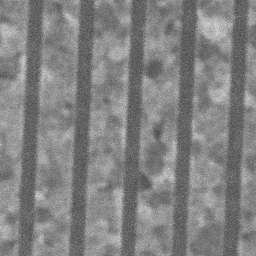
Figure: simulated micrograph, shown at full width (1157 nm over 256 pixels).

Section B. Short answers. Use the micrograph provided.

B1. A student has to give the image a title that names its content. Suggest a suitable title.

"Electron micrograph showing parallel lines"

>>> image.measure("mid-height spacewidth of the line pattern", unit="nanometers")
77.3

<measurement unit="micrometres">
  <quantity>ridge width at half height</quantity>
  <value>0.154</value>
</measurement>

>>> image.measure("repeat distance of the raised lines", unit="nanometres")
231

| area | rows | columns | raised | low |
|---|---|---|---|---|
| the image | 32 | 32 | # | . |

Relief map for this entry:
###...####..####..#####..####..#
###...####..####..#####..####..#
###..#####..####..#####..####..#
###...####..####..#####..####..#
###..#####..####..####...####..#
###..#####..####..####...####..#
###..#####..####..####..#####..#
###..#####..####..####...####..#
###..####...####..####...####..#
###..####...####..####..#####..#
###..####...####..####..#####..#
###..####...####..####..#####..#
###..####...####..####..#####..#
###..####..#####..####..####...#
###..####..#####..####..####...#
###..####..#####..####..####...#
###..####..#####..####..####...#
###..####..####...####..####..##
###..####..####...####..####..##
###..####..####...####..####..##
###..####..####...####..####..##
###..####..####...####..####..##
###..####..####..#####..####..##
##...####..####..#####..####..##
##...####..####..#####..####..##
##..#####..####..#####..####..##
##..#####..####..#####..####..##
##..#####..####..####...####..##
##..#####..####..####...####..##
##..#####..####..####...####..##
##..#####..####..####...####..##
##..####...####..####...####..##